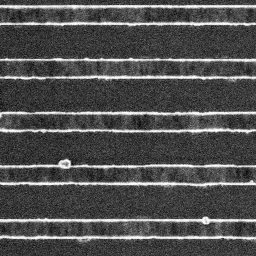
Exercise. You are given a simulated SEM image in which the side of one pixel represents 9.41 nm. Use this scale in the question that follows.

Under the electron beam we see lines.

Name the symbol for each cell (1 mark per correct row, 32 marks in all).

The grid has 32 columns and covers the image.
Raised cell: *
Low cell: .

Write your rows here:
................................
********************************
********************************
................................
................................
................................
................................
********************************
********************************
********************************
................................
................................
................................
................................
********************************
********************************
................................
................................
................................
................................
.......**.......................
********************************
********************************
................................
................................
................................
................................
.........................*......
********************************
********************************
................................
................................